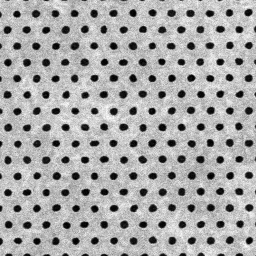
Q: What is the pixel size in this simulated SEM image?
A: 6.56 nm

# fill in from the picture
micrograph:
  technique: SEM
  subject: a regular array of holes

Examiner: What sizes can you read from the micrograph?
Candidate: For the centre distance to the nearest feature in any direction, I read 18.5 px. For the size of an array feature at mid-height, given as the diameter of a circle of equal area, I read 49.7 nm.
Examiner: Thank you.